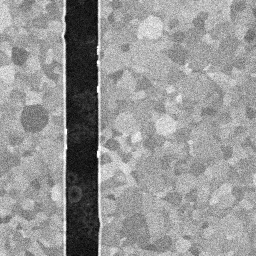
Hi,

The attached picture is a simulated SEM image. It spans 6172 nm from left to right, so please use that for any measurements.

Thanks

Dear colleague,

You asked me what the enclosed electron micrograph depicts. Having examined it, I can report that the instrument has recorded one or a few lines or trenches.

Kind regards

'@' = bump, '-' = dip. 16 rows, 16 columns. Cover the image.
@@@@--@@@@@@@@@@
@@@@--@@@@@@@@@@
@@@@--@@@@@@@@@@
@@@@--@@@@@@@@@@
@@@@--@@@@@@@@@@
@@@@--@@@@@@@@@@
@@@@--@@@@@@@@@@
@@@@--@@@@@@@@@@
@@@@--@@@@@@@@@@
@@@@--@@@@@@@@@@
@@@@--@@@@@@@@@@
@@@@--@@@@@@@@@@
@@@@--@@@@@@@@@@
@@@@--@@@@@@@@@@
@@@@--@@@@@@@@@@
@@@@--@@@@@@@@@@